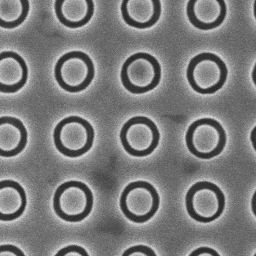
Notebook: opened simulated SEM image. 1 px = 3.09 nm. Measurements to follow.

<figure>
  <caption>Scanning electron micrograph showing a regular array of ring-shaped grooves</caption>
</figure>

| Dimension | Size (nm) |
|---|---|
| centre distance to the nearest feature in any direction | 199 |